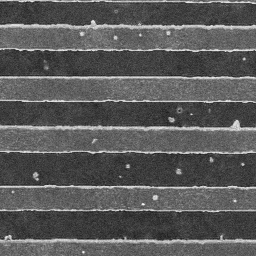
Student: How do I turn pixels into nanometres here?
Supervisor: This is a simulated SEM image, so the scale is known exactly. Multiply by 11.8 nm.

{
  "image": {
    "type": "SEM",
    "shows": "lines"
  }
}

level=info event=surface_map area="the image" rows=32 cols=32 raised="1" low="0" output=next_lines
00000000000000000000000000000000
00000000000000000000000000000000
00000000000000000000000000000000
11111111111111111111111111111111
11111111111111111111111111111111
11111111111111111111111111111111
00000000000000000000000000000000
00000000000000000000000000000000
00000000000000000000000000000000
00000000000000000000000000000000
11111111111111111111111111111111
11111111111111111111111111111111
11111111111111111111111111111111
00000000000000000000000000000000
00000000000000000000000000000000
00000000000000000000000000000100
11111111111111111111111111111111
11111111111111111111111111111111
11111111111111111111111111111111
00000000000000000000000000000000
00000000000000000000000000000000
00000000000000000000000000000000
00000000000000000000000000000000
11111111111111111111111111111111
11111111111111111111111111111111
11111111111111111111111111111111
00000000000000000000000000000000
00000000000000000000000000000000
00000000000000000000000000000000
00000000000000000000000000000000
11111111111111111111111111111111
11111111111111111111111111111111